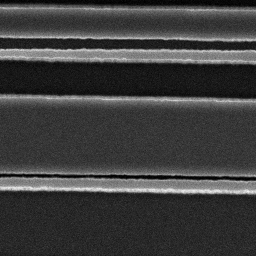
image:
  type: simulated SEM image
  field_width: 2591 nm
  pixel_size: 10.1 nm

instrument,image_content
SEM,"lines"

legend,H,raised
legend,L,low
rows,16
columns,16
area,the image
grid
HHHHHHLLLLLLLLLL
HHHHHHHHHHHHHHHH
HHHHHHHHHHHHHHHH
HHHHHHHHHHHHHHHH
LLLLLLLLLLLLLLLL
LLLLLLLLLLLLLLLL
HHHHHHHHHHHHHHHH
HHHHHHHHHHHHHHHH
HHHHHHHHHHHHHHHH
HHHHHHHHHHHHHHHH
HHHHHHHHHHHHHHHH
HHHHHHHHHHHHHHHH
LLLLLLLLLLLLLLLL
LLLLLLLLLLLLLLLL
LLLLLLLLLLLLLLLL
LLLLLLLLLLLLLLLL